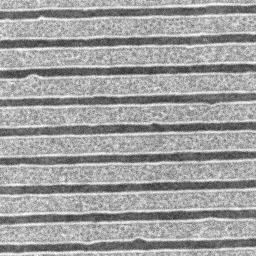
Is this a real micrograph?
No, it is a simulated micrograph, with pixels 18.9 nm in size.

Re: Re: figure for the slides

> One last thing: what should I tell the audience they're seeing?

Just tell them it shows parallel lines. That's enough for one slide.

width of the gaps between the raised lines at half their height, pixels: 10.2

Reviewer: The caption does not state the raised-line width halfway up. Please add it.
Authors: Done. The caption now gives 0.354 µm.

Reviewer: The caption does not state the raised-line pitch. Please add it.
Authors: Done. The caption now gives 552 nm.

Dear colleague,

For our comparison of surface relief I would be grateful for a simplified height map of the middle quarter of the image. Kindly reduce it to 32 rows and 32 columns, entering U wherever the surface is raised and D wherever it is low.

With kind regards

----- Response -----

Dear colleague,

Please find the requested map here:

UUUDUUUUUUUUDDDDDDDDDDDDDDDDDDDD
DDDDDDDDDDDDDDDDDDDDDDDDDDDDDDDD
DDDDDDDDDDDDDDDDDDDDDDDDDDDDDDDD
UUUUUUUUUUUUUUUUUUUUUUUUUUUUUUUU
UUUUUUUUUUUUUUUUUUUUUUUUUUUUUUUU
UUUUUUUUUUUUUUUUUUUUUUUUUUUUUUUU
UUUUUUUUUUUUUUUUUUUUUUUUUUUUUUUU
UUUUUUUUUUUUUUUUUUUUDDDDDDDDDDDD
DDDDDDDDDDDDDDDDDDDDDDDDDDDDDDDD
DDDDDDDDDDDDDDDDDDDDDDDDDDDDDDDD
DDDDDDDDDDDUUUUUUUUUUUUUUUUUUUUU
UUUUUUUUUUUUUUUUUUUUUUUUUUUUUUUU
UUUUUUUUUUUUUUUUUUUUUUUUUUUUUUUU
UUUUUUUUUUUUUUUUUUUUUUUUUUUUUUUU
UUUUUUUUUUUUUUUUUUUUUUDUUUUUUUUD
DDDDDDDDDDDDDDDDDDDDDDDDDDDDDDDD
DDDDDDDDDDDDDDDDDDDDDDDDDDDDDDDD
DDDDDDDDDDDDDDDDDDDUUUUUUUUUUUUU
UUUUUUUUUUUUUUUUUUUUUUUUUUUUUUUU
UUUUUUUUUUUUUUUUUUUUUUUUUUUUUUUU
UUUUUUUUUUUUUUUUUUUUUUUUUUUUUUUU
UUUUUUUUUUUUUUUUUUUUUUUUUUUUUUUU
UUUUUDDDDDDDDDDDDDDDDDDDDDDDDDDD
DDDDDDDDDDDDDDDDDDDDDDDDDDDDDDDD
DDDDDDDDDDDDDDDDDDDDDDDDDDDDDDDD
UUUUUUUUUUUUUUUUUUUUUUUUUUUUUUUU
UUUUUUUUUUUUUUUUUUUUUUUUUUUUUUUU
UUUUUUUUUUUUUUUUUUUUUUUUUUUUUUUU
UUUUUUUUUUUUUUUUUUUUUUUUUUUUUUUU
UUUUUUUUUUUUUUUUUUUUUUDDDDDDDDDD
DDDDDDDDDDDDDDDDDDDDDDDDDDDDDDDD
DDDDDDDDDDDDDDDDDDDDDDDDDDDDDDDD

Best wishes